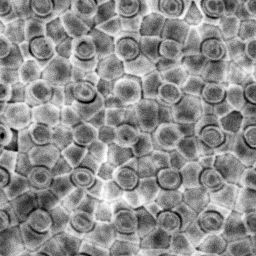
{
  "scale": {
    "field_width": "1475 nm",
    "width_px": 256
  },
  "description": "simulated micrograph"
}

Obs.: a regular array of raised bodies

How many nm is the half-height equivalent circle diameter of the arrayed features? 119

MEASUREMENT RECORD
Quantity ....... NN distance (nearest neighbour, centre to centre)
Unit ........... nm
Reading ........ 246